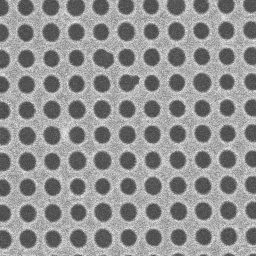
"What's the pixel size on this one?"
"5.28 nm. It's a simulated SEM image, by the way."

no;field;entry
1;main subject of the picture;a regular array of holes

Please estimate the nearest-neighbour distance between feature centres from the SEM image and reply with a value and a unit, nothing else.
132 nm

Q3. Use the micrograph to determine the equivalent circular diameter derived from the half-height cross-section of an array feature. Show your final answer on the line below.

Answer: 91.3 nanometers